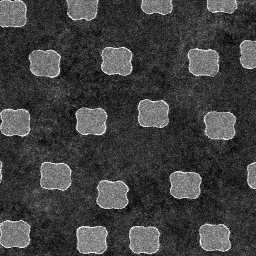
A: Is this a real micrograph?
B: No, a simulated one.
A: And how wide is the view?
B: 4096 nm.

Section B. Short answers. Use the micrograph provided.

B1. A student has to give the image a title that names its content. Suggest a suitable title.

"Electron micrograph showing a regular array of raised bodies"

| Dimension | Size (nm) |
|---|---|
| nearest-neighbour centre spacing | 982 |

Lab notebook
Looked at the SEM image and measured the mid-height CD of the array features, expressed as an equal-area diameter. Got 492 nm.